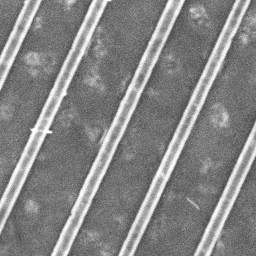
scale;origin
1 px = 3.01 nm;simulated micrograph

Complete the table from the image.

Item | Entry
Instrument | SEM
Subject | one or a few lines or trenches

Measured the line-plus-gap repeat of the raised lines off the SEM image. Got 195 nm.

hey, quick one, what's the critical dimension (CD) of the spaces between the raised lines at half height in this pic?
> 171 nm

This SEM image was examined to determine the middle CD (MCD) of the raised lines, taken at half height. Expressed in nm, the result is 32.7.